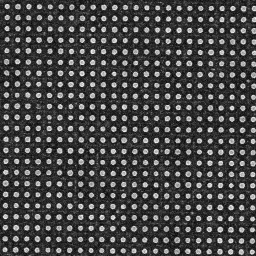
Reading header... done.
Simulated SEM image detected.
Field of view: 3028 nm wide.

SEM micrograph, a regular array of raised bodies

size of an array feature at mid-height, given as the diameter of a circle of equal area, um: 0.0566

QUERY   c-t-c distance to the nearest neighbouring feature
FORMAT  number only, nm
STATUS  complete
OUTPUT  124